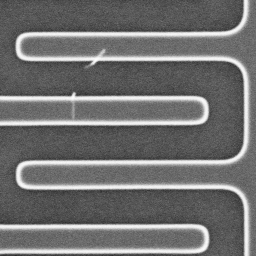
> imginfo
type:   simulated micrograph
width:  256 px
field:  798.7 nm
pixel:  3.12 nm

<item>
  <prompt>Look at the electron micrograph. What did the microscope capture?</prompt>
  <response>groups of lines, slits or small figures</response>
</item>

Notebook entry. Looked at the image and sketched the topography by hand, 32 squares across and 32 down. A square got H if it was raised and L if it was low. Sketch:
LLLLLLLLLLLLLLLLLLLLLLLLLLLLLLLH
LLLLLLLLLLLLLLLLLLLLLLLLLLLLLLLH
LLLLLLLLLLLLLLLLLLLLLLLLLLLLLLHH
LLLLLLLLLLLLLLLLLLLLLLLLLLLLLLHH
LLLHHHHHHHHHHHHHHHHHHHHHHHHHHHHH
LLHHHHHHHHHHHHHHHHHHHHHHHHHHHHHH
LLHHHHHHHHHHHHHHHHHHHHHHHHHHHHHH
LLLLLLLLLLLHLLLLLLLLLLLLLLLLHHHH
LLLLLLLLLLLLLLLLLLLLLLLLLLLLLLHH
LLLLLLLLLLLLLLLLLLLLLLLLLLLLLLLH
LLLLLLLLLLLLLLLLLLLLLLLLLLLLLLLH
LLLLLLLLLLLLLLLLLLLLLLLLLLLLLLLH
HHHHHHHHHHHHHHHHHHHHHHHHHLLLLLLH
HHHHHHHHHHHHHHHHHHHHHHHHHHLLLLLH
HHHHHHHHHHHHHHHHHHHHHHHHHHLLLLLH
HLLLLLLLLLLLLLLLLLLLLLLLLLLLLLLH
LLLLLLLLLLLLLLLLLLLLLLLLLLLLLLLH
LLLLLLLLLLLLLLLLLLLLLLLLLLLLLLLH
LLLLLLLLLLLLLLLLLLLLLLLLLLLLLLHH
LLLLLLLLLLLLLLLLLLLLLLLLLLLLLLHH
LLLHHHHHHHHHHHHHHHHHHHHHHHHHHHHH
LLHHHHHHHHHHHHHHHHHHHHHHHHHHHHHH
LLHHHHHHHHHHHHHHHHHHHHHHHHHHHHHH
LLLLLLLLLLLLLLLLLLLLLLLLLLLLHHHH
LLLLLLLLLLLLLLLLLLLLLLLLLLLLLLHH
LLLLLLLLLLLLLLLLLLLLLLLLLLLLLLLH
LLLLLLLLLLLLLLLLLLLLLLLLLLLLLLLH
LLLLLLLLLLLLLLLLLLLLLLLLLLLLLLLH
HHHHHHHHHHHHHHHHHHHHHHHHHLLLLLLH
HHHHHHHHHHHHHHHHHHHHHHHHHHLLLLLH
HHHHHHHHHHHHHHHHHHHHHHHHHHLLLLLH
LLLLLLLLLLLLLLLLLLLLLLLLLLLLLLLH